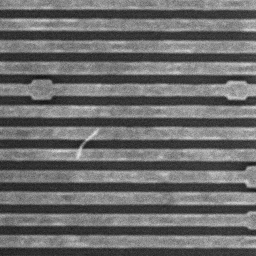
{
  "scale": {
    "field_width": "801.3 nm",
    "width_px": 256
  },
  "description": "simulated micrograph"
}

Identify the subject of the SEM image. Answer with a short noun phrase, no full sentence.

wiring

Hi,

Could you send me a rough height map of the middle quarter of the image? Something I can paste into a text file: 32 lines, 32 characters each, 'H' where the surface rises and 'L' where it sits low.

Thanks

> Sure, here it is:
HHHHHHHHHHHHHHHHHHHHHHHHHHHHHHHH
HHHHHHHHHHHHHHHHHHHHHHHHHHHHHHHH
LLLLLLLLLLLLLLLLLLLLLLLLLLLLLLLL
LLLLLLLLLLLLLLLLLLLLLLLLLLLLLLLL
LLLLLLLLLLLLLLLLLLLLLLLLLLLLLLLL
HHHHHHHHHHHHHHHHHHHHHHHHHHHHHHHH
HHHHHHHHHHHHHHHHHHHHHHHHHHHHHHHH
HHHHHHHHHHHHHHHHHHHHHHHHHHHHHHHH
LLLLLLLLLLLLLLLLLLLLLLLLLLLLLLLL
LLLLLLLLLLLLLLLLLLLLLLLLLLLLLLLL
HHHLLLLLLLLHHHLLLLLHHHLLLLLLHHHH
HHHHHHHHHHHHHHHHHHHHHHHHHHHHHHHH
HHHHHHHHHHHHHHHHHHHHHHHHHHHHHHHH
LLLLLLLLLLLLLLLLLLLLLLLLLLLLLLLL
LLLLLLLLLLLLLLLLLLLLLLLLLLLLLLLL
LLLLLLLLLLLLLLLLLLLLLLLLLLLLLLLL
HHHHHHHHHHHHHHHHHHHHHHHHHHHHHHHH
HHHHHHHHHHHHHHHHHHHHHHHHHHHHHHHH
HHHHHHHHHHHHHHHHHHHHHHHHHHHHHHHH
LLLLLLLLLLLLLLLLLLLLLLLLLLLLLLLL
LLLLLLLLLLLLLLLLLLLLLLLLLLLLLLLL
HHHHHHHHHHHHHHHHHHHHHHHHHHHHHHHH
HHHHHHHHHHHHHHHHHHHHHHHHHHHHHHHH
HHHHHHHHHHHHHHHHHHHHHHHHHHHHHHHH
LLLLLLLLLLLLLLLLLLLLLLLLLLLLLLLL
LLLLLLLLLLLLLLLLLLLLLLLLLLLLLLLL
LLLLLLLLLLLLLLLLLLLLLLLLLLLLLLLL
HHHHHHHHHHHHHHHHHHHHHHHHHHHHHHHH
HHHHHHHHHHHHHHHHHHHHHHHHHHHHHHHH
LLLLLLLLLLLLLLLLLLLLLLLLLLLLLLLL
LLLLLLLLLLLLLLLLLLLLLLLLLLLLLLLL
LLLLLLLLLLLLLLLLLLLLLLLLLLLLLLLL